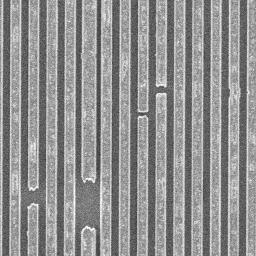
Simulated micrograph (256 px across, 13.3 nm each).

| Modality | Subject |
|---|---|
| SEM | parallel lines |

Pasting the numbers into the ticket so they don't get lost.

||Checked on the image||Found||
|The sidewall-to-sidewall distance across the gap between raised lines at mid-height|0.113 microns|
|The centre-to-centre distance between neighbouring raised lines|243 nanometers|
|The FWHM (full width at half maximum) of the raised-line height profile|128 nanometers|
